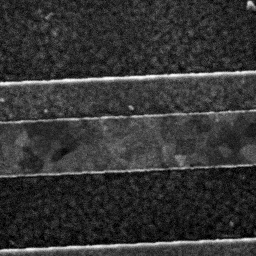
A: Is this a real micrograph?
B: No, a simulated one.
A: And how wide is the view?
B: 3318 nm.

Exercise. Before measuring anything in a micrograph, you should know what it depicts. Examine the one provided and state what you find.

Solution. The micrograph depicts lines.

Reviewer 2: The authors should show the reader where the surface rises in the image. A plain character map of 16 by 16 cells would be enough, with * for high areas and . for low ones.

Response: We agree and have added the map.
................
................
................
................
...............*
****************
****************
****************
****************
****************
************....
................
................
................
................
...*************